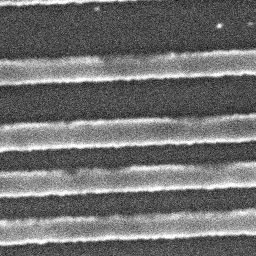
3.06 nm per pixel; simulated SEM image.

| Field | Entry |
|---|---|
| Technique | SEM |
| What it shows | lines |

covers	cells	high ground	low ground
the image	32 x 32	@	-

@@@@----------------------------
--------------------------------
--------------------------------
--------------------------------
--------------------------------
--------------------------------
-----------------------------@-@
----------@@@@@@@@@@@@@@@@@@@@@@
@@@@@@@@@@@@@@@@@@@@@@@@@@@@@@@@
@@@@@@@@@@@@@@@@@@@@@@@@--------
@@------------------------------
--------------------------------
--------------------------------
--------------------------------
-----------------------------@@@
---------@@@@@@@@@@@@@@@@@@@@@@@
@@@@@@@@@@@@@@@@@@@@@@@@@@@@@@@@
@@@@@@@@@@@@@@@@@@@@@@@@@@@@@@@-
@@@@@@--------------------------
--------------------------------
-------------------------------@
-----------@@@@@@@@@@@@@@@@@@@@@
@@@@@@@@@@@@@@@@@@@@@@@@@@@@@@@@
@@@@@@@@@@@@@@@@@@@@@@@@@@@-----
--------------------------------
--------------------------------
------------------------------@@
-------@@@@@@@@@@@@@@@@@@@@@@@@@
@@@@@@@@@@@@@@@@@@@@@@@@@@@@@@@@
@@@@@@@@@@@@@@@@@@@@@@@---------
@@------------------------------
--------------------------------